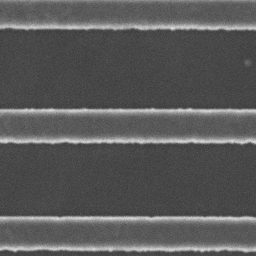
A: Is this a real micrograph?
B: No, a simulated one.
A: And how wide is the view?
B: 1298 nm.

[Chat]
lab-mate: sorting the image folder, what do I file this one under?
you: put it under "lines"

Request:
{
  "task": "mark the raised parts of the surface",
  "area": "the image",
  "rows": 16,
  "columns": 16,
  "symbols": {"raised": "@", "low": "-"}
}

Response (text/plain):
@@@@@@@@@@@@@@@@
@@@@@@@@@@@@@@@@
----------------
----------------
----------------
----------------
----------------
@@@@@@@@@@@@@@@@
@@@@@@@@@@@@@@@@
----------------
----------------
----------------
----------------
----------------
@@@@@@@@@@@@@@@@
@@@@@@@@@@@@@@@@